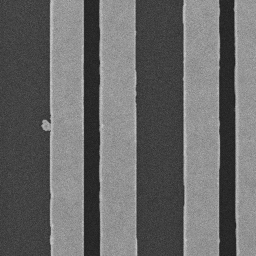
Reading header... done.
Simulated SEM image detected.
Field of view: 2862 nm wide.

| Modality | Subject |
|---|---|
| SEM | lines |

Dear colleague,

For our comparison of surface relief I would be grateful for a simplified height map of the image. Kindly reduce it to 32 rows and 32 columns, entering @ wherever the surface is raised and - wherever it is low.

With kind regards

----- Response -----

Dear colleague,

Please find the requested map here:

------@@@@--@@@@@------@@@@--@@@
------@@@@--@@@@@------@@@@--@@@
------@@@@--@@@@@------@@@@--@@@
------@@@@--@@@@@------@@@@--@@@
------@@@@---@@@@------@@@@--@@@
------@@@@--@@@@@------@@@@--@@@
------@@@@--@@@@@------@@@@--@@@
------@@@@--@@@@@------@@@@--@@@
------@@@@--@@@@@------@@@@--@@@
------@@@@---@@@@------@@@@--@@@
------@@@@--@@@@@------@@@@--@@@
------@@@@--@@@@@------@@@@--@@@
------@@@@--@@@@@------@@@@--@@@
------@@@@--@@@@@------@@@@--@@@
------@@@@--@@@@@------@@@@--@@@
------@@@@--@@@@@------@@@@--@@@
------@@@@--@@@@@------@@@@--@@@
------@@@@---@@@@------@@@@--@@@
------@@@@--@@@@@------@@@@--@@@
------@@@@--@@@@@------@@@@--@@@
------@@@@--@@@@@------@@@@--@@@
------@@@@--@@@@@------@@@@--@@@
------@@@@--@@@@@------@@@@--@@@
------@@@@---@@@@------@@@@--@@@
------@@@@--@@@@@------@@@@--@@@
------@@@@--@@@@@------@@@@--@@@
------@@@@---@@@@------@@@@--@@@
------@@@@---@@@@------@@@@--@@@
------@@@@---@@@@------@@@@--@@@
------@@@@---@@@@------@@@@---@@
------@@@@---@@@@------@@@@---@@
------@@@@---@@@@------@@@@---@@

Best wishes